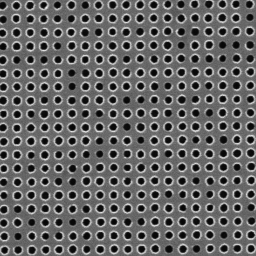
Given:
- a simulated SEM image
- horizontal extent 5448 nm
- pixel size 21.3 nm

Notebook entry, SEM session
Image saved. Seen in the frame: a regular array of holes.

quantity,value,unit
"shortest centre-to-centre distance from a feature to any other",283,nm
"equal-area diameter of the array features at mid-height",163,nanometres